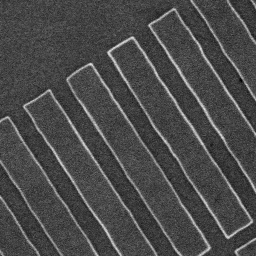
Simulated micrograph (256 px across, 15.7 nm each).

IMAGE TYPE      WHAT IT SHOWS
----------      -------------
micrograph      groups of lines, slits or small figures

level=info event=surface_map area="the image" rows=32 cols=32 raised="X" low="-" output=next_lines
------------------------XXXXX---
---------------------X---XXXX---
--------------------XXX---XXXX--
-------------------XXXX---XXXXX-
-------------------XXXXX---XXXX-
---------------XX---XXXXX--XXXXX
--------------XXXX---XXXX---XXXX
--------------XXXXX--XXXXX---XXX
----------XX---XXXX---XXXXX--XXX
---------XXX---XXXXX---XXXX---XX
---------XXXX---XXXX---XXXXX---X
---------XXXXX---XXXX---XXXX---X
----XXX---XXXX---XXXXX---XXXX---
---XXXXX---XXXX---XXXX---XXXXX--
----XXXX---XXXXX--XXXXX---XXXX--
XX--XXXXX---XXXX---XXXXX---XXXX-
XX---XXXXX--XXXXX---XXXX---XXXXX
XXX---XXXX---XXXXX--XXXXX---XXXX
XXXX--XXXXX---XXXX---XXXXX--XXXX
XXXX---XXXX---XXXXX---XXXX---XXX
XXXXX---XXXX---XXXXX---XXXX---XX
-XXXX---XXXXX---XXXX---XXXXX--XX
-XXXXX---XXXXX--XXXXX---XXXX---X
--XXXXX---XXXX---XXXXX--XXXXX---
---XXXX---XXXXX---XXXX---XXXXX--
X--XXXXX---XXXX---XXXXX---XXXX--
X---XXXXX---XXXX---XXXX---XXXXX-
XX---XXXX---XXXXX---XXXX---XXXX-
XXX--XXXXX---XXXX---XXXXX---XX--
XXX---XXXXX---XXXX---XXXX---X---
XXXX---XXXX---XXXXX---XXXX-----X
XXXXX--XXXXX---XXXX---XXXX----XX